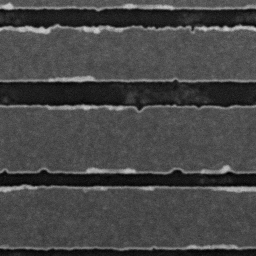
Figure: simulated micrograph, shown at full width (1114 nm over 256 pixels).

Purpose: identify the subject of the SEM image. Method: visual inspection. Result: one or a few lines or trenches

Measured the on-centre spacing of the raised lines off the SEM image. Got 355 nm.